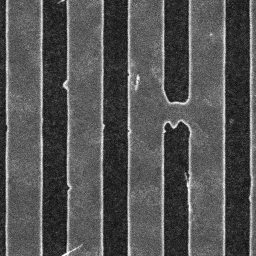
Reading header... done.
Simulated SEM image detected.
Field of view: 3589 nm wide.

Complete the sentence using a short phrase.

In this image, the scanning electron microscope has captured parallel lines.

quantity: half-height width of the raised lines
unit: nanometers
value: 501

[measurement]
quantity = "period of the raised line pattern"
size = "855 nanometres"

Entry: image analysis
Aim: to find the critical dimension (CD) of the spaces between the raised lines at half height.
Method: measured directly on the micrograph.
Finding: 361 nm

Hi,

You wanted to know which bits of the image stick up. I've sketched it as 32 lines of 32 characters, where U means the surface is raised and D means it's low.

DUUUUDDDUUUUUDDDUUUUDDDDUUUUDDDU
DUUUUDDDUUUUUDDDUUUUDDDDUUUUDDDU
DUUUUDDDUUUUUDDDUUUUDDDDUUUUDDDU
DUUUUDDDUUUUUDDDUUUUDDDDUUUUDDDU
DUUUUDDDUUUUUDDDUUUUDDDDUUUUDDDU
DUUUUDDDUUUUUDDDUUUUDDDDUUUUDDDU
DUUUUDDDUUUUUDDDUUUUDDDDUUUUDDDU
DUUUUDDDUUUUUDDDUUUUDDDDUUUUDDDU
DUUUUDDDUUUUUDDDUUUUDDDDUUUUDDDU
DUUUUDDDUUUUUDDDUUUUDDDDUUUUDDDU
DUUUUDDDUUUUUDDDUUUUDDDDUUUUDDDU
DUUUUDDDUUUUUDDDUUUUUDDDUUUUDDDU
DUUUUDDDUUUUUDDDUUUUUDDUUUUUDDDU
DUUUUDDDDUUUUDDDUUUUUUUUUUUUDDDU
DUUUUDDDDUUUUDDDUUUUUUUUUUUUDDDU
DUUUUDDDDUUUUDDDUUUUUUDUUUUUDDDU
DUUUUDDDDUUUUDDDUUUUUDDDUUUUDDDU
DUUUUDDDDUUUUDDDUUUUDDDDUUUUDDDU
DUUUUDDDDUUUUDDDUUUUDDDDUUUUDDDU
DUUUUDDDUUUUUDDDUUUUDDDDUUUUDDDU
DUUUUDDDUUUUUDDDUUUUDDDDUUUUDDDU
DUUUUDDDUUUUUDDDUUUUDDDDUUUUDDDU
DUUUUDDDUUUUUDDDUUUUDDDDUUUUDDDU
DUUUUDDDDUUUUDDDUUUUDDDUUUUUDDDU
DUUUUDDDDUUUUDDDUUUUDDDDUUUUDDDU
DUUUUDDDDUUUUDDDUUUUDDDDUUUUDDDU
DUUUUDDDDUUUUDDDUUUUDDDDUUUUDDDU
DUUUUDDDDUUUUDDDUUUUDDDDUUUUDDDU
DUUUUDDDUUUUUDDDUUUUDDDDUUUUDDDU
DUUUUDDDUUUUUDDDUUUUDDDDUUUUDDDU
DUUUUDDDUUUUUDDDUUUUDDDDUUUUDDDU
DUUUUDDDUUUUUDDDUUUUDDDDUUUUDDDU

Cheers